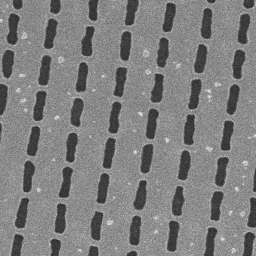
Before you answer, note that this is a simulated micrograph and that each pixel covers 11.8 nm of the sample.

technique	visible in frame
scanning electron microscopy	a regular array of holes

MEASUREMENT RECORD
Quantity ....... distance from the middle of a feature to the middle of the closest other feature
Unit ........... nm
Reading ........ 420